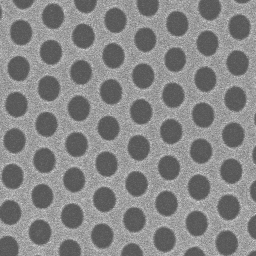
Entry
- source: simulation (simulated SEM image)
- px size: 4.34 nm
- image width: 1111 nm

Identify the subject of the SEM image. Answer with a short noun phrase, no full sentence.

a regular array of holes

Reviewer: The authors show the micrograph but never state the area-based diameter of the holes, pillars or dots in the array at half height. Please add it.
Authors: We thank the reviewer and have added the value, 105 nm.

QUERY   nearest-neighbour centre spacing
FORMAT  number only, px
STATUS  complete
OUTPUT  35.9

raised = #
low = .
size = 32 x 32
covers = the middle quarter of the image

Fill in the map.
##.....####...####....###.....##
#......##########.....####...###
#......##########......#########
##.....##########......#########
##....####...####.....##########
#########.....####....###....###
#########......##########.....##
#########......#########......##
##...####.....##########......##
#.....####....###....####.....##
#......##########.....####...###
#......#########......##########
#.....##########......##########
##....###....####.....##########
#########.....####...####....###
########......##########.....###
########......##########......##
#....####.....##########......##
#.....####...####...####.....###
......##########.....####...####
......##########......##########
#.....##########.....##########.
#....####...####.....##########.
########.....####...####....####
########.....###########.....###
########.....##########......###
#...####.....##########......###
.....####....###....####.....###
.....###########.....####...####
.....##########......##########.
.....##########......##########.
#...####....####.....##########.